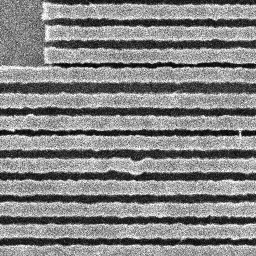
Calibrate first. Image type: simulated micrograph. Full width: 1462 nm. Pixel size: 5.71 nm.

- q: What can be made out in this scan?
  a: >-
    parallel lines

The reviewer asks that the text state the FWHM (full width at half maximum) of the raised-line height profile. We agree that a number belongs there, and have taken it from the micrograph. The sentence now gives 88.5 nm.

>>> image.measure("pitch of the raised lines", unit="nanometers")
126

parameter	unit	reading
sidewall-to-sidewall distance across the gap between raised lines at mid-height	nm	39.3